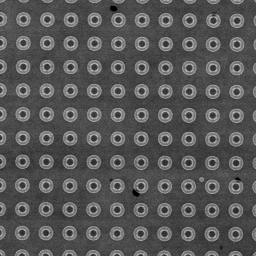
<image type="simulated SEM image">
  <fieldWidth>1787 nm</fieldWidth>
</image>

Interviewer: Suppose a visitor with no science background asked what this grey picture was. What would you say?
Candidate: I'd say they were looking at an array of small figures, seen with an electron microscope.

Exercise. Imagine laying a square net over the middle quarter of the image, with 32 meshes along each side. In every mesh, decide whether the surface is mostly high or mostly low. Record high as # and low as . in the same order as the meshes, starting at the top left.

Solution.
###...###...###...###...###...##
###...###...###...###...###...##
...................#.....#....##
................................
................................
###...###...###...##....##....##
###...###...###...###...###...##
###...###...###...###...###...##
...............................#
................................
................................
###...###...###...##....##....##
###...###...###...###...###...##
###...###...###...###...###...##
...............................#
................................
................................
###...###...###...###...###...##
###...###...###...###...###...##
###...###...###...###...###...##
................................
................................
................................
###...###...###...###...##....##
###...###...###...###...###..###
###...###...###...###...###...##
................................
................................
................................
###...###...###...###...###...##
###...###...###...###...###..###
###...###...###...###...###...##